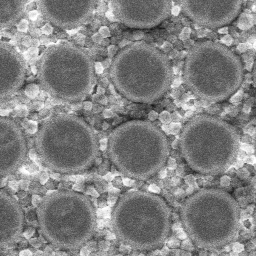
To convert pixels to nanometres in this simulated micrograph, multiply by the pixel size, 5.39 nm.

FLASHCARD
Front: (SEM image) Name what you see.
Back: a regular array of raised bodies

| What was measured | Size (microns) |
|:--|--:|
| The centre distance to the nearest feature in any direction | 0.384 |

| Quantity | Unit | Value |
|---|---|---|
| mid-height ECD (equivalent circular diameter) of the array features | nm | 296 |